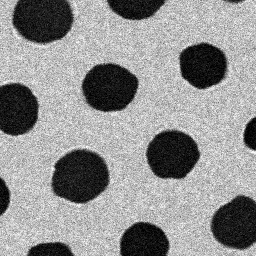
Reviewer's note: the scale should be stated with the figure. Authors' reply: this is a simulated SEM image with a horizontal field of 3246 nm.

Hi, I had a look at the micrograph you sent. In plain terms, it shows holes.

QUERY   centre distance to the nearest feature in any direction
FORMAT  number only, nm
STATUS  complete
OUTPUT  1180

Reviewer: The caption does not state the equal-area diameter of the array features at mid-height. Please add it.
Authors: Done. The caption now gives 656 nm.